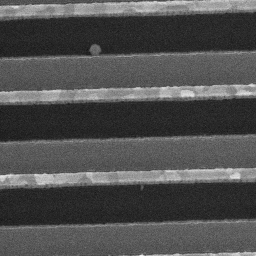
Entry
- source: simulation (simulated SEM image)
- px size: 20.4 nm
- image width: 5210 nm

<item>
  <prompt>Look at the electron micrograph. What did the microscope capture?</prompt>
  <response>lines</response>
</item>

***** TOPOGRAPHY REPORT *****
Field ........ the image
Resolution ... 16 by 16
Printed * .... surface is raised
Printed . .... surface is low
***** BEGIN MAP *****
****************
................
................
.......*********
****************
****************
................
................
................
****************
****************
****............
................
................
****************
****************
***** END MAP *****